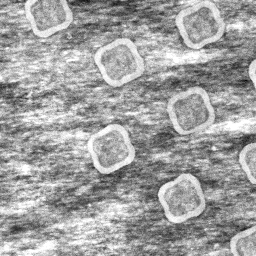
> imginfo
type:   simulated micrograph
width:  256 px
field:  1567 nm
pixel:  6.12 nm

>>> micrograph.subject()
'raised bodies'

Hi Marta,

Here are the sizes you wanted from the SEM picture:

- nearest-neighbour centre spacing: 86.4 px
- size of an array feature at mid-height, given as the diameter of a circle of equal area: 254 nm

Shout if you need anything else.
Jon